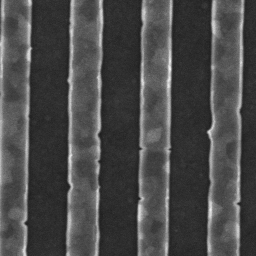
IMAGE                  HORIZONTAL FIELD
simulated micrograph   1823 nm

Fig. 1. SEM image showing one or a few lines or trenches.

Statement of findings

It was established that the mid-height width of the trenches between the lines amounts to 41.7 pixels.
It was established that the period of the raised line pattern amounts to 502 nm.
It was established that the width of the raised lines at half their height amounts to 206 nm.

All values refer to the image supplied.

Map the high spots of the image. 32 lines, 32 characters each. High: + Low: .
++++.....++++.....+++......+++..
++++.....++++.....+++......+++..
++++.....++++.....+++......+++..
++++.....++++.....+++......+++..
++++.....++++.....+++......+++..
++++.....++++.....+++......+++..
++++.....++++.....+++......+++..
++++.....++++.....+++......+++..
++++.....+++......+++......+++..
++++.....+++......+++......+++..
++++.....++++.....+++.....++++..
++++.....+++......+++.....++++..
++++.....+++......+++.....++++..
+++......+++......+++......+++..
+++......+++......+++......+++..
+++......+++......+++......+++..
+++......+++......+++.....++++..
+++......+++......+++.....++++..
+++......+++......+++.....++++..
+++......+++......+++.....++++..
+++......+++......+++.....++++..
+++......+++......+++.....++++..
+++......+++......+++.....++++..
+++......+++......+++.....++++..
+++......+++......+++.....++++..
+++......+++.....++++.....++++..
+++......+++.....++++.....++++..
+++......+++.....++++.....++++..
+++......+++.....++++.....++++..
+++......+++.....++++.....++++..
+++.....++++.....++++.....++++..
+++.....++++.....++++.....++++..